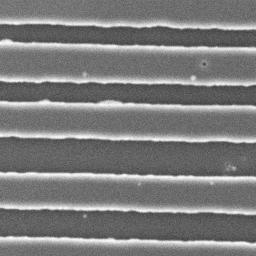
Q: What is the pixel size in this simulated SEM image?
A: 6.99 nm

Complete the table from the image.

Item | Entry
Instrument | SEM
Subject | lines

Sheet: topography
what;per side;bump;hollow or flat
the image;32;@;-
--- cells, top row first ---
@@@@@@@@@@@@@@@@@@@@@@@@@@@@@@@@
@@@@@@@@@@@@@@@@@@@@@@@@@@@@@@@@
@@@@@@@@@@@@@@@@@@@@@@@@@@@@@@@@
----------------------@--@@@@@@@
--------------------------------
@@@@@@@@------------------------
@@@@@@@@@@@@@@@@@@@@@@@@@@@@@@@@
@@@@@@@@@@@@@@@@@@@@@@@@@@@@@@@@
@@@@@@@@@@@@@@@@@@@@@@@@@@@@@@@@
@@@@@@@@@@@@@@@@@@@@@@@@@@@@@@@@
------------------------@@@@@@@@
--------------------------------
--------------------------------
@@@@@@@@@@@@@@@@@@@@@@@@@@@@@@@@
@@@@@@@@@@@@@@@@@@@@@@@@@@@@@@@@
@@@@@@@@@@@@@@@@@@@@@@@@@@@@@@@@
@@@@@@@@@@@@@@@@@@@@@@@@@@@@@@@@
-------------------@@@@@@@@@@@@@
--------------------------------
--------------------------------
--------------------------------
--------------------------------
@@@@@@@@@@@@@@@@@@@@@@@@@@@@@@@@
@@@@@@@@@@@@@@@@@@@@@@@@@@@@@@@@
@@@@@@@@@@@@@@@@@@@@@@@@@@@@@@@@
@@@@@@@@@@@@@@@@@@@@@@@@@@@@@@@@
-----------------------@@-@@@@@@
--------------------------------
--------------------------------
--------------------------------
@@@@@@@@@@@@@@@@@@@@@@@@@@@@@@@@
@@@@@@@@@@@@@@@@@@@@@@@@@@@@@@@@